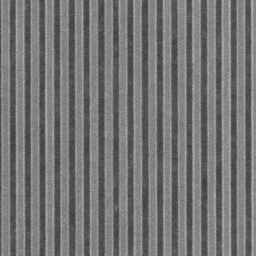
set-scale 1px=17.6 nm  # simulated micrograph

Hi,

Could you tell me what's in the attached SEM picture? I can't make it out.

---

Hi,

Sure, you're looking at parallel lines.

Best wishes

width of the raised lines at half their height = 126 nm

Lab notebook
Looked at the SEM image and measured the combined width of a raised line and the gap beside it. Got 0.259 microns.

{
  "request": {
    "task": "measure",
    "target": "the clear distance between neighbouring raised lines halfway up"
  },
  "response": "126 nm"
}